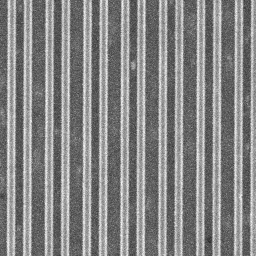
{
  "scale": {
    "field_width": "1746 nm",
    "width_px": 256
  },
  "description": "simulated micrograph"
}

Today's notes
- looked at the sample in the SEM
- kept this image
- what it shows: parallel lines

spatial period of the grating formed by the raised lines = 0.129 micrometres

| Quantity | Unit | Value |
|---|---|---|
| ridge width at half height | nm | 49.4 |